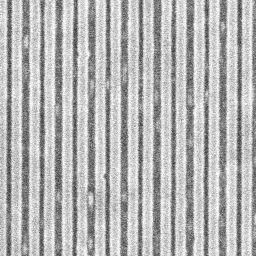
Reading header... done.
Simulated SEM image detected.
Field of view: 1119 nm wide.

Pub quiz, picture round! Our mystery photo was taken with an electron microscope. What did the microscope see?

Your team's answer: parallel lines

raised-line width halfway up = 38.8 nanometers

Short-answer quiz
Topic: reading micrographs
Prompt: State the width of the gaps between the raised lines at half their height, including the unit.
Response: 27.3 nanometers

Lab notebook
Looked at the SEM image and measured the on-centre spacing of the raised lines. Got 0.0719 µm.